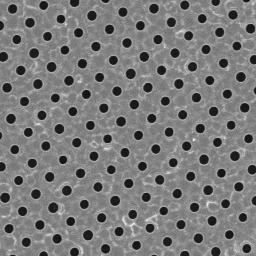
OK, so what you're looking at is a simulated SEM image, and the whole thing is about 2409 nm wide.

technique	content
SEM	a regular array of holes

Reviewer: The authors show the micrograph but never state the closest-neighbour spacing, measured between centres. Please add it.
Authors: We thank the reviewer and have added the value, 205 nm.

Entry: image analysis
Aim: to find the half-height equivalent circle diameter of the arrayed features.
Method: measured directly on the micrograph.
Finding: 0.0882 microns